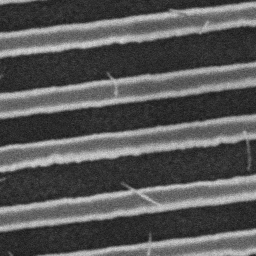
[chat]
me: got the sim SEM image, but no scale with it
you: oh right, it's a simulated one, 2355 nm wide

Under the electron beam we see lines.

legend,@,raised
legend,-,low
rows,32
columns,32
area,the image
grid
------------------------------@@
---------------------@@@@@@@@@@@
--------------@@@@@@@@@@@@@@@@@@
-----@@@@@@@@@@@@@@@@@@@@@@@----
@@@@@@@@@@@@@@@@@@@@@-----------
@@@@@@@@@@@@@-------------------
@@@@@@--------------------------
--------------------------------
--------------------------@@@@@@
-----------------@@@@@@@@@@@@@@@
----------@@@@@@@@@@@@@@@@@@@@@@
---@@@@@@@@@@@@@@@@@@@@@@@------
@@@@@@@@@@@@@@@@@@--------------
@@@@@@@@@@----------------------
@@-----------------------------@
-----------------------@@@@@@@@@
----------------@@@@@@@@@@@@@@@@
-------@@@@@@@@@@@@@@@@@@@@@@@--
@@@@@@@@@@@@@@@@@@@@@@----------
@@@@@@@@@@@@@@@-----------------
@@@@@@--------------------------
--------------------------------
---------------------------@@@@@
-------------------@@@@@@@@@@@@@
------------@@@@@@@@@@@@@@@@@@@@
----@@@@@@@@@@@@@@@@@@@@@@@-----
@@@@@@@@@@@@@@@@@@--------------
@@@@@@@@@@@---------------------
@@@-----------------------------
--------------------------@@@@@@
------------------@@@@@@@@@@@@@@
---------@@@@@@@@@@@@@@@@@@@@@@@